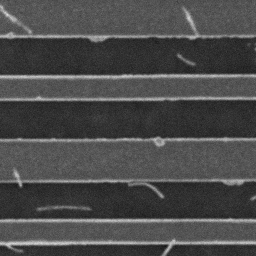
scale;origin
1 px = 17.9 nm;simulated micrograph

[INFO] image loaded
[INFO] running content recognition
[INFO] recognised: lines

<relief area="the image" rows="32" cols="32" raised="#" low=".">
################################
################################
################################
################################
################################
................................
................................
................................
................................
....................#.##########
################################
################################
................................
................................
................................
................................
................................
################################
################################
################################
################################
################################
################################
................................
................................
................................
................................
....############################
################################
################################
###..................#..........
................................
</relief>